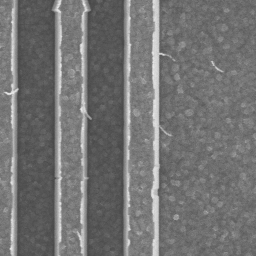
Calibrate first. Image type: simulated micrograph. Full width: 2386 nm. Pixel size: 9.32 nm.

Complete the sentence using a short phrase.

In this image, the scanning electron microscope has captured one or a few lines or trenches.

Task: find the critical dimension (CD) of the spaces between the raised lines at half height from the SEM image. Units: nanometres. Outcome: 376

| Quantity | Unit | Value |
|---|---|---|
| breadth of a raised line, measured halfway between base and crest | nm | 290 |